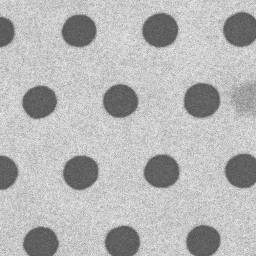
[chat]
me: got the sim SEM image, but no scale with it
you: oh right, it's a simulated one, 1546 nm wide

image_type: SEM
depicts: holes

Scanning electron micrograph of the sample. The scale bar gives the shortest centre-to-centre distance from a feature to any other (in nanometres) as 490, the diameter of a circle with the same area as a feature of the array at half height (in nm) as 207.